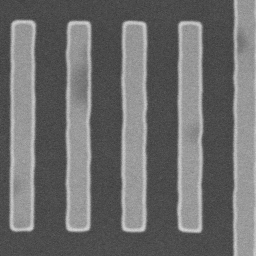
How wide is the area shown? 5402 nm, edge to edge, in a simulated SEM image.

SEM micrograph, groups of lines, slits or small figures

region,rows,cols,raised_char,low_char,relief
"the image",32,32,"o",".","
..............................oo
..............................oo
..............................oo
..oo.....oo.....oo....ooo....ooo
..oo.....oo....ooo....ooo....ooo
..oo.....oo....ooo.....oo....ooo
..oo.....oo....ooo.....oo.....oo
..oo.....oo....ooo....ooo.....oo
..oo.....oo....ooo....ooo.....oo
..oo.....oo....ooo....ooo....ooo
.ooo.....oo....ooo....ooo....ooo
.ooo.....oo....ooo....ooo.....oo
..oo.....oo.....oo....ooo....ooo
..oo.....oo.....oo....ooo....ooo
..oo.....oo.....oo....ooo....ooo
..oo.....oo.....oo....ooo.....oo
..oo.....oo....ooo....ooo....ooo
..oo.....oo....ooo....ooo....ooo
.ooo.....oo....ooo....ooo....ooo
.ooo.....oo....ooo....ooo....ooo
.ooo.....oo....ooo....ooo....ooo
.ooo.....oo....ooo....ooo....ooo
.ooo.....oo....ooo....ooo....ooo
.ooo.....oo....ooo....ooo....ooo
.ooo.....oo....ooo....ooo....ooo
.ooo.....oo....ooo....ooo....ooo
.ooo.....oo....ooo....ooo....ooo
.ooo....ooo....ooo....ooo....ooo
..oo.....oo.....oo.....oo....ooo
.............................ooo
.............................ooo
.............................ooo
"